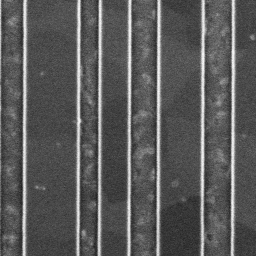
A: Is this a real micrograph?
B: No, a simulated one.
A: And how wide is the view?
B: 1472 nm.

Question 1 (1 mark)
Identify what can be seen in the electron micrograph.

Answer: one or a few lines or trenches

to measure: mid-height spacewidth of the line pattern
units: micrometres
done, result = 0.165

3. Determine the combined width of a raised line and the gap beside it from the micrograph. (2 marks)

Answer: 371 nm